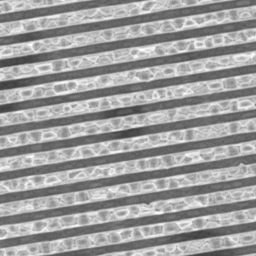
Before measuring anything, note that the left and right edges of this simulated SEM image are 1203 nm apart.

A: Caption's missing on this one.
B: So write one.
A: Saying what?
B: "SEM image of parallel lines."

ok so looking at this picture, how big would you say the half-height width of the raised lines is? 60.9 nm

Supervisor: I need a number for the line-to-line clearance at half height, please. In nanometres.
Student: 44.7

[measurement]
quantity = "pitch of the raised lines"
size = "104 nm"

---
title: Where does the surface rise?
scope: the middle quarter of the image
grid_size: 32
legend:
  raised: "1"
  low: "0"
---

11111111000000000000000011111111
11000000000000000011111111111111
00000000000111111111111111111110
00000111111111111111111110000000
11111111111111111110000000000000
11111111111100000000000000011111
11111100000000000000001111111111
00000000000000001111111111111111
00000000011111111111111111110000
00011111111111111111111000000000
11111111111111111000000000000000
11111111110000000000000000111111
11110000000000000000111111111111
00000000000001111111111111111111
00000011111111111111111111000000
01111111111111111111000000000000
11111111111111100000000000000111
11111110000000000000000111111111
11000000000000000111111111111111
00000000000111111111111111111100
00001111111111111111111100000000
11111111111111111100000000000000
11111111111000000000000000011111
11111000000000000000011111111111
00000000000000011111111111111111
00000000011111111111111111110000
00111111111111111111110000000000
11111111111111000000000000000001
11111111110000000000000000111111
11100000000000000001111111111111
00000000000001111111111111111110
00000001111111111111111110000000